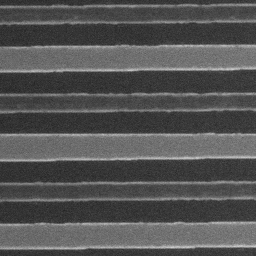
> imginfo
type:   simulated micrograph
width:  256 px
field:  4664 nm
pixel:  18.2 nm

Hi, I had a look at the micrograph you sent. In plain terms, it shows lines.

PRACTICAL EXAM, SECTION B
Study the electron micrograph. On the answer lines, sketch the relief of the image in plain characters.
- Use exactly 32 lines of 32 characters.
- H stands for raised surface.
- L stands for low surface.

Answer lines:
LLLLLLLLLLLLLLLLLLLLLLLLLLLLLLLL
HHHHHHHHHHHHHHHHHHHHHHHHHHHHHHHH
HHHHHHHHHHHHHHHHHHHHHHHHHHHHHHHH
LLLLLLLLLLLLLLLLLLLLLLLLLLLLLLLL
LLLLLLLLLLLLLLLLLLLLLLLLLLLLLLLL
LLLLLLLLLLLLLLLLLLLLLLLLLLLLLLLL
HHHHHHHHHHHHHHHHHHHHHHHHHHHHHHHH
HHHHHHHHHHHHHHHHHHHHHHHHHHHHHHHH
HHHHHHHHHHHHHHHHHHHHHHHHHHHHHHHH
LLLLLLLLLLLLLLLLLLLLLLLLLLLLLLLL
LLLLLLLLLLLLLLLLLLLLLLLLLLLLLLLL
LLLLLLLLLLLLLLLLLLLLLLLLLLLLLLLL
HHHHHHHHHHHHHHHHHHHHHHHHHHHHHHHH
HHHHHHHHHHHHHHHHHHHHHHHHHHHHHHHH
LLLLLLLLLLLLLLLLLLLLLLLLLLLLLLLL
LLLLLLLLLLLLLLLLLLLLLLLLLLLLLLLL
LLLLLLLLLLLLLLLLLLLLLLLLLLLLLLLL
HHHHHHHHHHHHHHHHHHHHHHHHHHHHHHHH
HHHHHHHHHHHHHHHHHHHHHHHHHHHHHHHH
HHHHHHHHHHHHHHHHHHHHHHHHHHHHHHHH
LLLLLLLLLLLLLLLLLLLLLLLLLLLLLLLL
LLLLLLLLLLLLLLLLLLLLLLLLLLLLLLLL
LLLLLLLLLLLLLLLLLLLLLLLLLLLLLLLL
HHHHHHHHHHHHHHHHHHHHHHHHHHHHHHHH
HHHHHHHHHHHHHHHHHHHHHHHHHHHHHHHH
LLLLLLLLLLLLLLLLLLLLLLLLLLLLLLLL
LLLLLLLLLLLLLLLLLLLLLLLLLLLLLLLL
LLLLLLLLLLLLLLLLLLLLLLLLLLLLLLLL
HHHHHHHHHHHHHHHHHHHHHHHHHHHHHHHH
HHHHHHHHHHHHHHHHHHHHHHHHHHHHHHHH
HHHHHHHHHHHHHHHHHHHHHHHHHHHHHHHH
LLLLLLLLLLLLLLLLLLLLLLLLLLLLLLLL